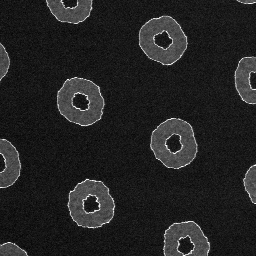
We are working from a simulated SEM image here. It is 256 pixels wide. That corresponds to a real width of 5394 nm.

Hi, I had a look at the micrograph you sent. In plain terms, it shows ring-shaped raised bodies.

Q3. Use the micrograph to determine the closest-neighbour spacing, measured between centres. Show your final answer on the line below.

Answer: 2160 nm